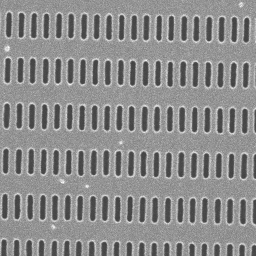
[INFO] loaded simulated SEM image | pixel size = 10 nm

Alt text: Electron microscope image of a regular array of holes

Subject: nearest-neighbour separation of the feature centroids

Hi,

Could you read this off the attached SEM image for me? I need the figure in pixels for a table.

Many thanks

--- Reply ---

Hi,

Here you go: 12.3